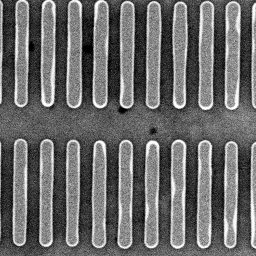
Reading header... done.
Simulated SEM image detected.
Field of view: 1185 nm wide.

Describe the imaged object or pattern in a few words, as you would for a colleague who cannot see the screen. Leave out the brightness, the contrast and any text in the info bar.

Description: groups of lines, slits or small figures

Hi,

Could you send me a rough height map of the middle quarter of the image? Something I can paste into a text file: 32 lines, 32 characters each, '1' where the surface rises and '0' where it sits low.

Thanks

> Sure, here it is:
01110000111000111000011100001100
01110000111000111000011100001100
01110001111000111000011100001100
01110001111000111000011100001100
01110001111000111000011100001100
01110001111000011000011100001100
01110001111000011000011100011100
01110001111000111000011100011100
01110001111000111000011100011100
01110001111000111000011100001100
01100000110000011000011000001100
00000000000000000000000000000000
00000000000000000000000000000000
00000000000000000000000000000000
00000000000000000000000000000000
00000000000000000000000000000000
00000000000000000000000000000000
00000000000000000000000000000000
00000000000000000000000000000000
01100000100000110000000000011100
01110000110000111000011000011100
01110000110000111000011000011100
01110000110000111000011100011100
01110001110000111000011100011100
01110001110000111000011100011100
01110001110000111000111100011100
01110001110000111000111100011100
01110001110000111000111100011100
01110001110000111000111100011100
01110001110000111000111100011100
01110001110000111000111000011100
01110001110000111000111000011100